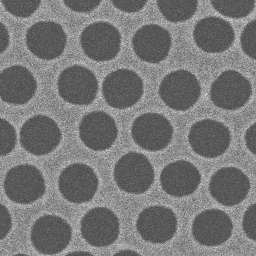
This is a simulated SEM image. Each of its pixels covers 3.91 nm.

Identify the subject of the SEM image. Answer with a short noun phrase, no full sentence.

a regular array of holes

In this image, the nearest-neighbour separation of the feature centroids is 49.9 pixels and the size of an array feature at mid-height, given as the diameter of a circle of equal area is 158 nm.